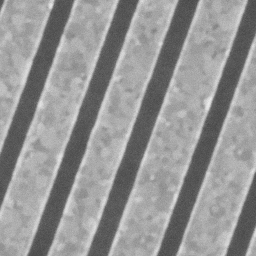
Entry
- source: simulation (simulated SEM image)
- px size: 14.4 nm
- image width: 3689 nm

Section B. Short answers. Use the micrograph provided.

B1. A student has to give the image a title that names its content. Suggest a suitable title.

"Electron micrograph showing lines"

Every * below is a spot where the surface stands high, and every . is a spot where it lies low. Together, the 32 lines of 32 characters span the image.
*******..******..*****...******.
******...*****...*****..******..
******...*****...****...******..
******..******..*****...******..
*****...*****...*****..******...
*****..******..*****...******...
****...*****...*****...******..*
****...*****...*****..******...*
****..******..*****...******..**
***...*****...*****...******..**
***...*****...****...******...**
***..******..*****...******..***
**...*****...*****...******..***
**...*****...****...******...***
**..******..*****...******..****
*...*****...*****..******...****
*...*****..*****...******...****
*..******..*****...******..*****
...*****...*****..******...*****
..******...****...******...*****
..*****...*****...******..******
..*****...*****..******...******
.******..*****...******..*******
.*****...*****...******..******.
.*****...*****..******...******.
******..*****...******..******..
*****...*****..*******..******..
*****...****...******...******..
*****..*****...******..******...
****...*****..******...******...
****...****...******...******..*
****..*****...******..******...*